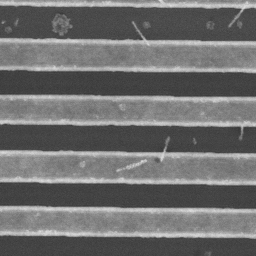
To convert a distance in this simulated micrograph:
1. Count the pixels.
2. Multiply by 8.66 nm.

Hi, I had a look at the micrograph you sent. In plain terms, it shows lines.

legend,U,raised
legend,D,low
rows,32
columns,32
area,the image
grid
UUUUUUUUUUUUUUUUUUUUUUUUUUUUUUUU
DDDDDDDDDDDDDDDDDDDDDDDDDDDDDDDD
DDDDDDDDDDDDDDDDDDDDDDDDDDDDDDDD
DDDDDDDDDDDDDDDDDDDDDDDDDDDDDDDD
DDDDDDDDDDDDDDDDDDDDDDDDDDDDDDDD
UUUUUUUUUUUUUUUUUUUUUUUUUUUUUUUU
UUUUUUUUUUUUUUUUUUUUUUUUUUUUUUUU
UUUUUUUUUUUUUUUUUUUUUUUUUUUUUUUU
UUUUUUUUUUUUUUUUUUUUUUUUUUUUUUUU
DDDDDDDDDDDDDDDDDDDDDDDDDDDDDDDD
DDDDDDDDDDDDDDDDDDDDDDDDDDDDDDDD
DDDDDDDDDDDDDDDDDDDDDDDDDDDDDDDD
UUUUUUUUUUUUUUUUUUUUUUUUUUUUUUUU
UUUUUUUUUUUUUUUUUUUUUUUUUUUUUUUU
UUUUUUUUUUUUUUUUUUUUUUUUUUUUUUUU
DDDUUUUUUUUUUUUUUUUUUUUUUUUUUUUU
DDDDDDDDDDDDDDDDDDDDDDDDDDDDDDDD
DDDDDDDDDDDDDDDDDDDDDDDDDDDDDDDD
DDDDDDDDDDDDDDDDDDDDDDDDDDDDDDDD
UUUUUUUUUUUUUUUUUUUUUUUUUUUUUUUU
UUUUUUUUUUUUUUUUUUUUUUUUUUUUUUUU
UUUUUUUUUUUUUUUUUUUUUUUUUUUUUUUU
UUUUUUUUUUUUUUUUUUUUUUUUUUUUUUUU
DDDDDDDDDDDDDDDDDDDDDDDDDDDDDDDD
DDDDDDDDDDDDDDDDDDDDDDDDDDDDDDDD
DDDDDDDDDDDDDDDDDDDDDDDDDDDDDDDD
UUUUUUUUUUUUUUUUUUUUUUUUUUUUUUUU
UUUUUUUUUUUUUUUUUUUUUUUUUUUUUUUU
UUUUUUUUUUUUUUUUUUUUUUUUUUUUUUUU
DDDDDDDDDUDUUUUUUUUUUUUUUUUUUUUU
DDDDDDDDDDDDDDDDDDDDDDDDDDDDDDDD
DDDDDDDDDDDDDDDDDDDDDDDDDDDDDDDD